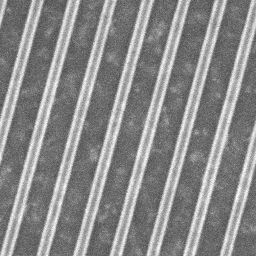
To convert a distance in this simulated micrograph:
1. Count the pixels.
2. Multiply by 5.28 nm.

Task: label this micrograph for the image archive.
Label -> parallel lines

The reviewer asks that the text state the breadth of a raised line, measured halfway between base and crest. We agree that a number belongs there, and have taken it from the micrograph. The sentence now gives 43.3 nm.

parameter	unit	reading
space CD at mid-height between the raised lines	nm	140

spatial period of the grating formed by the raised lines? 186 nanometres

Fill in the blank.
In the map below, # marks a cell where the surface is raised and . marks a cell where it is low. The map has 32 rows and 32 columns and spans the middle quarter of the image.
......###......###......###.....
......##.......##.......###.....
......##.......##.......##......
.....###......###.......##......
.....##.......###......###......
.....##.......##.......##.......
....###.......##.......##.......
....###......###.......##.......
....##.......##.......###.......
....##.......##.......##.......#
...###.......##.......##.......#
...##.......###.......##.......#
...##.......##.......###......##
...##.......##.......##.......##
..###.......##.......##.......##
..##.......###......###.......##
..##.......###......###......###
..##.......##.......##.......##.
.###......###.......##.......##.
.##.......###......###.......##.
.##.......##.......##.......###.
###.......##.......##.......##..
###......###.......##.......##..
##.......###......###.......##..
##.......##.......##.......###..
##.......##.......##.......##...
#.......###.......##.......##...
#.......##.......###......###...
#.......##.......##.......##....
#.......##.......##.......##....
.......###......###.......##....
.......###......##.......###....